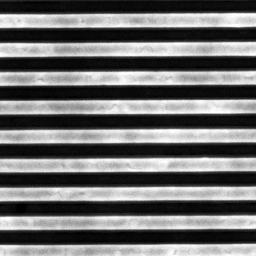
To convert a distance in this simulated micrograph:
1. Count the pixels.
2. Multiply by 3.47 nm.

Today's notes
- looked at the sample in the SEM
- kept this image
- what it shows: parallel lines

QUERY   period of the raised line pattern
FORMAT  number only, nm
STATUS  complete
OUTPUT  100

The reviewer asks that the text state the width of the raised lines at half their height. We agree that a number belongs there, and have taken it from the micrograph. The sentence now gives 51.6 nanometers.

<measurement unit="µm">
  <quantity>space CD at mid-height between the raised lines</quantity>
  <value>0.0481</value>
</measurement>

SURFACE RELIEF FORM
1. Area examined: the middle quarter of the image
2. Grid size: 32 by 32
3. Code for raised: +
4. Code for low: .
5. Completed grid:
................................
................................
++++++++++++++++++++++++++++++++
++++++++++++++++++++++++++++++++
++++++++++++++++++++++++++++++++
................................
................................
................................
................................
++++++++++++++++++++++++++++++++
++++++++++++++++++++++++++++++++
++++++++++++++++++++++++++++++++
+++++++++++++.+++++..+++++++++++
................................
................................
................................
++++++++++++++++++++++++++++++++
++++++++++++++++++++++++++++++++
++++++++++++++++++++++++++++++++
++++++++++++++++++++++++++++++++
................................
................................
................................
++++++++++++++++++++++++++++++++
++++++++++++++++++++++++++++++++
++++++++++++++++++++++++++++++++
++++++++++++++++++++++++++++++++
................................
................................
................................
................................
++++++++++++++++++++++++++++++++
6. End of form